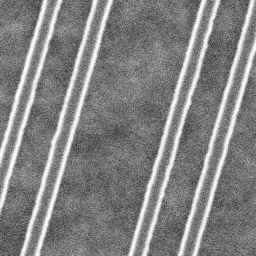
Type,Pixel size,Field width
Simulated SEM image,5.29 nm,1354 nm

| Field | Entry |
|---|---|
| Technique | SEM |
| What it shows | lines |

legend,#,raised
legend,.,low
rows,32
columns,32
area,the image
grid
.....###....##...........##....#
.....##....##............##....#
.....##....##............##....#
.....##....##...........##.....#
....##.....##...........##....##
....##....##............##....##
....##....##...........##.....##
...##.....##...........##....##.
...##....###...........##....##.
...##....##............##....##.
...##....##...........##.....##.
..##.....##...........##....##..
..##....##............##....##..
..##....##...........##.....##..
.##.....##...........##....##...
.##....##............##....##...
.##....##............##....##...
.##....##...........##....###...
##....###...........##....##....
##....##............##....##....
##....##...........###....##....
#.....##...........##....##.....
#....##............##....##.....
#....##............##....##.....
#....##...........##....###.....
.....##...........##....##......
....##............##....##......
....##...........##.....##......
....##...........##....##.......
...##............##....##.......
...##............##....##.......
...##...........##....###.......